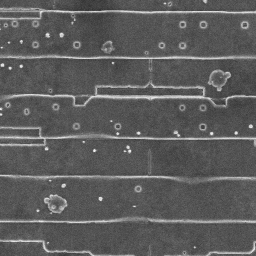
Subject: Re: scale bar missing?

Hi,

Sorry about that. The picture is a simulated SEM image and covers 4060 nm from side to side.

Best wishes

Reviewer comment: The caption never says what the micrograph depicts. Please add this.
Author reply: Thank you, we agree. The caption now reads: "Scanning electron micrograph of wiring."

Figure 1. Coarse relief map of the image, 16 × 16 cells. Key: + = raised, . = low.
................
++++++++++++++++
++++++++++++++++
++++++++++++++++
................
................
++++++++++++++++
++++++++++++++++
...+++++++++++++
................
................
++++++++++++++++
++++++++++++++++
++++++++++++++++
................
................